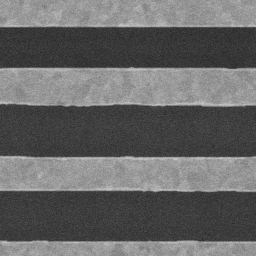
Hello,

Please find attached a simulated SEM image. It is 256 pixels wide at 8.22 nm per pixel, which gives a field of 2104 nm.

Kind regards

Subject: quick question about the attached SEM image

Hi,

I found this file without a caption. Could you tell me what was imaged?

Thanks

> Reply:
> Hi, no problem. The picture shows lines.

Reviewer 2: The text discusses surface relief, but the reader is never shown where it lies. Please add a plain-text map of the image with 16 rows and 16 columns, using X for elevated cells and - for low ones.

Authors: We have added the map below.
XXXXXXXXXXXXXXXX
XXXXXXXXXXXXXXXX
----------------
----------------
XXXXXXXXXXXXXXXX
XXXXXXXXXXXXXXXX
--XXXXX--XXXXXXX
----------------
----------------
----------------
XXXXXXXXXXXXXXXX
XXXXXXXXXXXXXXXX
----------------
----------------
----------------
XXXXXXXXXXXXXXXX